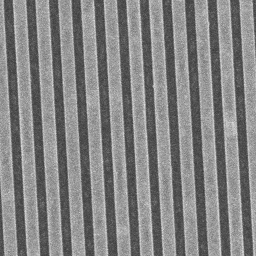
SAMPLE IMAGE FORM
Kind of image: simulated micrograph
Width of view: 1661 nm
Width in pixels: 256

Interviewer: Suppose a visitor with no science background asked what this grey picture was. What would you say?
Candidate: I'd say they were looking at parallel lines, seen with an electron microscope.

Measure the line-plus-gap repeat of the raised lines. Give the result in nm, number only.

147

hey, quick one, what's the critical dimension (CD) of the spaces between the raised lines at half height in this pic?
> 68.1 nanometers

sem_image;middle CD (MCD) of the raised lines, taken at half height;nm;80.2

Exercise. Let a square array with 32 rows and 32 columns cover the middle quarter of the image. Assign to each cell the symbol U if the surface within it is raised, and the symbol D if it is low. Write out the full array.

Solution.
UUUDDUUUDDDUUUDDDUUUDDUUUDDDUUUD
UUUDDUUUDDDUUUDDDUUUDDUUUDDDUUUD
UUUDDUUUDDDUUUDDDUUUDDUUUDDDUUUD
UUUDDUUUDDDUUUDDDUUUDDDUUDDDUUUD
UUUDDUUUDDDUUUDDDUUUDDDUUDDDUUUD
UUUDDDUUDDDUUUDDDUUUDDUUUUDDUUUD
UUUDDDUUDDDUUUDDDUUUDDDUUUDDUUUD
UUUDDDUUUDDUUUDDDUUUDDDUUUDDUUUD
UUUDDDUUUDDUUUDDDUUUDDDUUUDDUUUD
UUUDDDUUUDDUUUUDDUUUDDDUUUDDUUUD
UUUDDDUUUDDDUUUDDUUUDDDUUUDDUUUU
UUUDDDUUUDDDUUUDDUUUDDDUUUDDUUUU
UUUDDDUUUDDDUUUDDUUUDDDUUUDDDUUU
UUUDDDUUUDDDUUUDDUUUDDDUUUDDDUUU
UUUDDDUUUDDDUUUDDUUUDDDUUUDDDUUU
UUUDDDUUUDDDUUUDDUUUDDDUUUDDDUUU
UUUUDDUUUDDDUUUDDDUUDDDUUUDDDUUU
UUUUDDUUUDDDUUUDDDUUDDDUUUDDDUUU
DUUUDDUUUDDDUUUDDDUUUDDUUUDDDUUU
DUUUDDUUUDDDUUUDDDUUUDDUUUDDDUUU
DUUUDDUUUDDDUUUDDDUUUDDUUUDDDUUU
DUUUDDUUUDDDUUUDDDUUUDDDUUDDDUUU
DUUUDDUUUDDDUUUDDDUUUDDDUUDDDUUU
DUUUDDDUUDDDUUUDDDUUUDDDUUUDDUUU
DUUUDDDUUDDDUUUDDDUUUDDDUUUDDUUU
DUUUDDDUUUDDUUUDDDUUUDDDUUUDDUUU
DUUUDDDUUUDDUUUDDDUUUDDDUUUDDUUU
DUUUDDDUUUDDUUUUDDUUUDDDUUUDDUUU
DUUUDDDUUUDDUUUUDDUUUDDDUUUDDUUU
DUUUDDDUUUDDDUUUDDUUUDDDUUUDDUUU
DUUUDDDUUUDDDUUDDDUUUDDDUUUDDDUU
DUUUDDDUUUDDDUUUDDUUUDDDUUUDDDUU